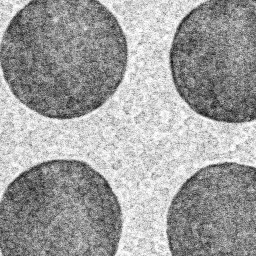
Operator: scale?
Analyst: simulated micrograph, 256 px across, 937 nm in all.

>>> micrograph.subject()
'holes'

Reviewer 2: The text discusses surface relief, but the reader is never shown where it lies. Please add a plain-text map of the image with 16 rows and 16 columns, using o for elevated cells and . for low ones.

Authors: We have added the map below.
o......ooooo....
o......oooo.....
........ooo.....
........ooo.....
........ooo.....
o......oooo.....
o.....oooooo....
ooooooooooooo...
oooooooooooooooo
oooooooooooooooo
oo....ooooooo...
o......oooo.....
.......oooo.....
........oo......
........oo......
.......oooo.....